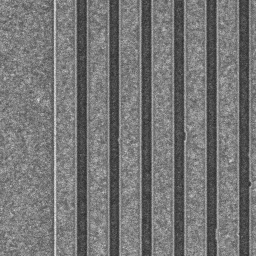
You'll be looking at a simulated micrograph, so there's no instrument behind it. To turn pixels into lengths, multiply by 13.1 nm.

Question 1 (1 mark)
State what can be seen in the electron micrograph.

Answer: parallel lines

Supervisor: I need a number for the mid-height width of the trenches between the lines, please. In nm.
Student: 136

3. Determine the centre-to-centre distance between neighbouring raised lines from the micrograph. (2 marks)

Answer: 424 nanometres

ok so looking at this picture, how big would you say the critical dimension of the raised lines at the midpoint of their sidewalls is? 21.6 px